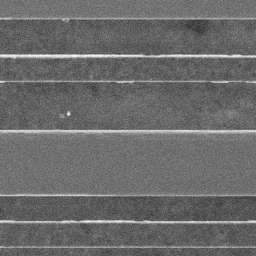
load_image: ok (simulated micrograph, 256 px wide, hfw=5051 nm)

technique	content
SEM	lines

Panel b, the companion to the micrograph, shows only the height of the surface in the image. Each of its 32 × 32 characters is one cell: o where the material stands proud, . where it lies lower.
oooooooooooooooooooooooooooooooo
oooooooooooooooooooooooooooooooo
................................
................................
................................
................................
................................
oooooooooooooooooooooooooooooooo
oooooooooooooooooooooooooooooooo
oooooooooooooooooooooooooooooooo
................................
................................
................................
................................
................................
................................
o....oooo..o....................
oooooooooooooooooooooooooooooooo
oooooooooooooooooooooooooooooooo
oooooooooooooooooooooooooooooooo
oooooooooooooooooooooooooooooooo
oooooooooooooooooooooooooooooooo
oooooooooooooooooooooooooooooooo
oooooooooooooooooooooooooooooooo
................................
................................
................................
................................
oooooooooooooooooooooooooooooooo
oooooooooooooooooooooooooooooooo
oooooooooooooooooooooooooooooooo
................................